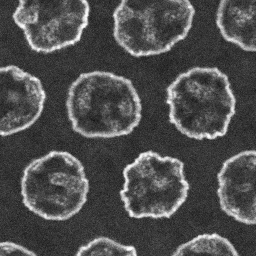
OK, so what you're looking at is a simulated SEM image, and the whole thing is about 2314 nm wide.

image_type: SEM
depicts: raised bodies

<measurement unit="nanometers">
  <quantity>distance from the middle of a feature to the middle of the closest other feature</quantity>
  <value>856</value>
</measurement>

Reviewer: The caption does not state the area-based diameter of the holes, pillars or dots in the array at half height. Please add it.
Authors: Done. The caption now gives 578 nanometres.